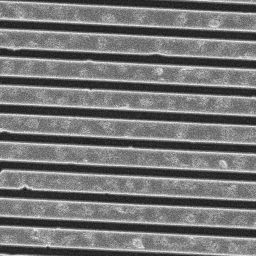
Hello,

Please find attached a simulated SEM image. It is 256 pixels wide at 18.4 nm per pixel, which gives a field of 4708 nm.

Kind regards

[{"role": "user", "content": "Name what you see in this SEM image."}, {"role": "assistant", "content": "parallel lines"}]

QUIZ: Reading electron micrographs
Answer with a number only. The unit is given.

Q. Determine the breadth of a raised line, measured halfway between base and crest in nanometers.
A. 351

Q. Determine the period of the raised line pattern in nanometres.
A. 516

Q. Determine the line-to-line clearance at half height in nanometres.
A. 158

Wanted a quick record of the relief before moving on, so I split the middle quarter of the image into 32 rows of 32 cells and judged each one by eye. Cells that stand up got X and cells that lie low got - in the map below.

XXXXXXXXXXXXXXXXXXXXXXXXXXXXXXX-
XXXXXXXXXXXXXXXXXXXXXXXXXXXXXXXX
XXXXXXXXXXXXXXXXXXXXXXXXXXXXXXXX
XXXXXXXXXXXXXXXXXXXXXXXXXXXXXXXX
---------------XXXXXXXXXXXXXXXXX
--------------------------------
XXXXXXXX------------------------
XXXXXXXXXXXXXXXXXXXXXXXXXXXX----
XXXXXXXXXXXXXXXXXXXXXXXXXXXXXXXX
XXXXXXXXXXXXXXXXXXXXXXXXXXXXXXXX
XXXXXXXXXXXXXXXXXXXXXXXXXXXXXXXX
-----------------XXXXXXXXXXXXXXX
--------------------------------
XXXXX---------------------------
XXXXXXXXXXXXXXXXXXXXXXXXX-------
XXXXXXXXXXXXXXXXXXXXXXXXXXXXXXXX
XXXXXXXXXXXXXXXXXXXXXXXXXXXXXXXX
XXXXXXXXXXXXXXXXXXXXXXXXXXXXXXXX
-------------XXXXXXXXXXXXXXXXXXX
--------------------------------
XXXXXX--------------------------
XXXXXXXXXXXXXXXXXXXXXXXXXX------
XXXXXXXXXXXXXXXXXXXXXXXXXXXXXXXX
XXXXXXXXXXXXXXXXXXXXXXXXXXXXXXXX
XXXXXXXXXXXXXXXXXXXXXXXXXXXXXXXX
--------------XXXXXXXXXXXXXXXXXX
--------------------------------
XXXXXXX-------------------------
XXXXXXXXXXXXXXXXXXXXXXXXXXX-----
XXXXXXXXXXXXXXXXXXXXXXXXXXXXXXXX
XXXXXXXXXXXXXXXXXXXXXXXXXXXXXXXX
XXXXXXXXXXXXXXXXXXXXXXXXXXXXXXXX